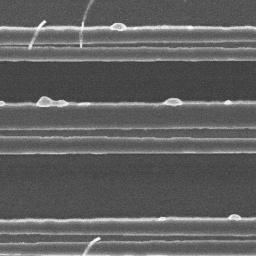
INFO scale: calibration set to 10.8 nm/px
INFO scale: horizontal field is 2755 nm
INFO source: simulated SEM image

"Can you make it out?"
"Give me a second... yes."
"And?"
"lines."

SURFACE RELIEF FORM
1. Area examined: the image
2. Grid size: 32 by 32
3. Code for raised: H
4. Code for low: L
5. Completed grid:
LLLLLLLLLLLLLLLLLLLLLLLLLLLLLLLL
LLLLLLLLLLLLLLLLLLLLLLLLLLLLLLLL
LLLLLLLLLLLLLLLLLLLLLLLLLLLLLLLL
LLLLLHLLLLLLLHHHHHLLHLHHHHLLLLHH
HHHHHHHHHHHHHHHHHHHHHHHHHHHHHHHH
HHHHHHHHHHHHHHHHHHHHHHHHHHHHHHHH
HHHHHHHHHHHHHHHHHHHHHHHHHHHHHHHH
HHHHHHHHHHHHHHHHHHHHHHHHHHHHHHHH
LLLLLLLLLLLLLLLLLLLLLLLLLLLLLLLL
LLLLLLLLLLLLLLLLLLLLLLLLLLLLLLLL
LLLLLLLLLLLLLLLLLLLLLLLLLLLLLLLL
LLLLLLLLLLLLLLLLLLLLLLLLLLLLLLLL
LLLLLHHLLLLLLLLLLLLLLHLLLLLLLLLL
HHHHHHHHHHHHHHHHHHHHHHHHHHHHHHHH
HHHHHHHHHHHHHHHHHHHHHHHHHHHHHHHH
HHHHHHHHHHHHHHHHHHHHHHHHHHHHHHHH
HHHHHHHHHHHHHHHHHHHHHHHHHHHHHHHH
HHHHHHHHHHHHHHHHHHHHHHHHHHHHHHHH
HHHHHHHHHHHHHHHHHHHHHHHHHHHHHHHH
LLLLLLLLLLLLLLLLLLLLLLLLLLLLLLLL
LLLLLLLLLLLLLLLLLLLLLLLLLLLLLLLL
LLLLLLLLLLLLLLLLLLLLLLLLLLLLLLLL
LLLLLLLLLLLLLLLLLLLLLLLLLLLLLLLL
LLLLLLLLLLLLLLLLLLLLLLLLLLLLLLLL
LLLLLLLLLLLLLLLLLLLLLLLLLLLLLLLL
LLLLLLLLLLLLLLLLLLLLLLLLLLLLLLLL
LLLLLLLLLLLLLLLLLLLLLLLLLLLLLLLL
LLLLLLLLLLLLLLLLLLLHHHHHHLHHHHHH
HHHHHHHHHHHHHHHHHHHHHHHHHHHHHHHH
HHHHHHHHHHHHHHHHHHHHHHHHHHHHHHHH
HHHHHHHHHHHHHHHHHHHHHHHHHHHHHHHH
HHHHHHHHHHHHHHHHHHHHHHHHHHHHHHHH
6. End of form